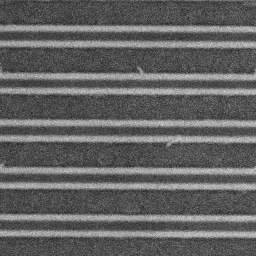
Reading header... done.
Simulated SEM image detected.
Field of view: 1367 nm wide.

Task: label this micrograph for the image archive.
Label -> parallel lines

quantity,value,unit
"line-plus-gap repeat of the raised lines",253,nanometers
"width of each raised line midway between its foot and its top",0.0855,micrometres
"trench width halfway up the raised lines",169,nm